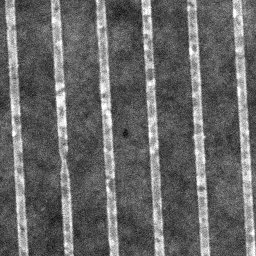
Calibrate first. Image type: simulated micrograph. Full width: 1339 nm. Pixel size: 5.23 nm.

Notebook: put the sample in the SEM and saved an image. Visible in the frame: parallel lines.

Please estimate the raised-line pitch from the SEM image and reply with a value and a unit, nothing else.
238 nanometers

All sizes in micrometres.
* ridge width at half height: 0.0411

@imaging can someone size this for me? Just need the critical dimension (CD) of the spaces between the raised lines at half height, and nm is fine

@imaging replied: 199